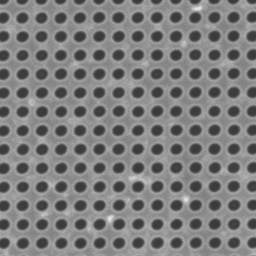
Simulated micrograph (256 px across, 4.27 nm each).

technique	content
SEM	a regular array of holes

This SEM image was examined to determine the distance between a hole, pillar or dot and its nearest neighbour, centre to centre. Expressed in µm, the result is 0.0793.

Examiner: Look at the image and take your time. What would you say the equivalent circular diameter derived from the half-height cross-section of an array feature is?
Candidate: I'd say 48.9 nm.